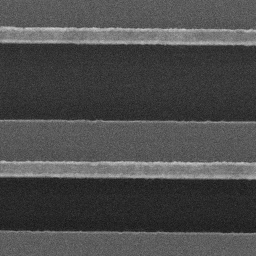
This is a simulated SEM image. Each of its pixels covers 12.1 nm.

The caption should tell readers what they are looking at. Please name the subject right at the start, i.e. lines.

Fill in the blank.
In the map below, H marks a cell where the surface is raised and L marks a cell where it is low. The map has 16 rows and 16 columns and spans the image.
HHHHHHHHHHHHHHHH
HHHHHHHHHHHHHHHH
HHHHHHHHHHHHHHHH
LLLLLLLLLLLLLLLL
LLLLLLLLLLLLLLLL
LLLLLLLLLLLLLLLL
LLLLLLLLLLLLLLLL
LLLLLLLLLLLLLLLL
HHHHHHHHHHHHHHHH
HHHHHHHHHHHHHHHH
HHHHHHHHHHHHHHHH
LLLLLLLLLLLLLLLL
LLLLLLLLLLLLLLLL
LLLLLLLLLLLLLLLL
HHHHHHLLLLLLLLLL
HHHHHHHHHHHHHHHH